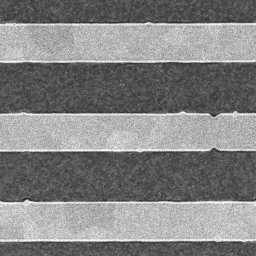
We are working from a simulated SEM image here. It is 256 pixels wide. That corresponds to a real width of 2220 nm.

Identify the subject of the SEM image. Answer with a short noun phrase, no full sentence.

one or a few lines or trenches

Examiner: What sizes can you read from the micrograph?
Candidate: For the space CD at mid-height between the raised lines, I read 453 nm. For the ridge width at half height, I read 37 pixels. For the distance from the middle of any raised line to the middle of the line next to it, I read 0.774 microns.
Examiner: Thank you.